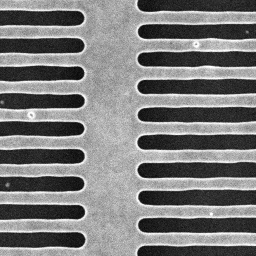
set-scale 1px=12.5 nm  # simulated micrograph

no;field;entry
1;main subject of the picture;groups of lines, slits or small figures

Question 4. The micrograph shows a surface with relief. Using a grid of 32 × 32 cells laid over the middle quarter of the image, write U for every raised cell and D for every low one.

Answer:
UUUUUUUUUUUUUUUUUUUDDDDDDDDDDDDD
DDDDDUUUUUUUUUUUUUUUUUUUUUUUUUUU
DDDDDUUUUUUUUUUUUUUUUUUUUUUUUUUU
DDDDDUUUUUUUUUUUUUUUUUUUUUUUUUUU
UUUUUUUUUUUUUUUUUUUDDDDDDDDDDDDD
UUUUUUUUUUUUUUUUUUDDDDDDDDDDDDDD
UUUUUUUUUUUUUUUUUUDDDDDDDDDDDDDD
DDDDUUUUUUUUUUUUUUUDDDDDDDDDDDDD
DDDDDUUUUUUUUUUUUUUUUUUUUUUUUUUU
DDDDDUUUUUUUUUUUUUUUUUUUUUUUUUUU
DDDDDUUUUUUUUUUUUUUUUUUUUUUUUUUU
UUUUUUUUUUUUUUUUUUUDDDDDDDDDDDDD
UUUUUUUUUUUUUUUUUUDDDDDDDDDDDDDD
UUUUUUUUUUUUUUUUUUUDDDDDDDDDDDDD
DDDDUUUUUUUUUUUUUUUUUDDDDDDDDDDD
DDDDDUUUUUUUUUUUUUUUUUUUUUUUUUUU
DDDDDUUUUUUUUUUUUUUUUUUUUUUUUUUU
DDDDUUUUUUUUUUUUUUUUUUUDDDUUUUUD
UUUUUUUUUUUUUUUUUUUDDDDDDDDDDDDD
UUUUUUUUUUUUUUUUUUDDDDDDDDDDDDDD
UUUUUUUUUUUUUUUUUUDDDDDDDDDDDDDD
DDDDUUUUUUUUUUUUUUUUDDDDDDDDDDDD
DDDDDUUUUUUUUUUUUUUUUUUUUUUUUUUU
DDDDDUUUUUUUUUUUUUUUUUUUUUUUUUUU
DDDDDUUUUUUUUUUUUUUUUUUUUUUUDDUU
UUUUUUUUUUUUUUUUUUUDDDDDDDDDDDDD
UUUUUUUUUUUUUUUUUUDDDDDDDDDDDDDD
UUUUUUUUUUUUUUUUUUUDDDDDDDDDDDDD
DDDDUUUUUUUUUUUUUUUUDDDDDDDDDDDD
DDDDDUUUUUUUUUUUUUUUUUUUUUUUUUUU
DDDDDUUUUUUUUUUUUUUUUUUUUUUUUUUU
DDDDUUUUUUUUUUUUUUUUDDDDDDDDDDDD